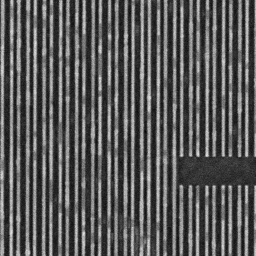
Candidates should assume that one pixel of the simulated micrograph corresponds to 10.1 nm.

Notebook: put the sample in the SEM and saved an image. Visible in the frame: parallel lines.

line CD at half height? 26.4 nanometers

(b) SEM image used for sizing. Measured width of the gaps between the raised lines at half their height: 0.0603 um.